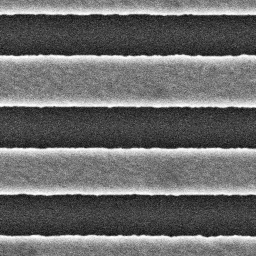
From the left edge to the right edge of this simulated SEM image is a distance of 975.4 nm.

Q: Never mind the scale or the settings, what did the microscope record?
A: lines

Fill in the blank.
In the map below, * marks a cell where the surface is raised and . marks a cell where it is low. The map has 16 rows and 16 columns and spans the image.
****************
................
................
..**.......*...*
****************
****************
****************
................
................
****************
****************
****************
................
................
................
****************